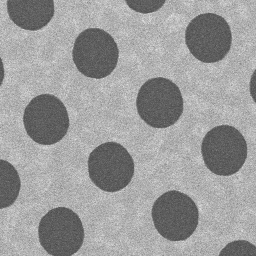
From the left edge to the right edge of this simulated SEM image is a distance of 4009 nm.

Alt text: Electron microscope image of holes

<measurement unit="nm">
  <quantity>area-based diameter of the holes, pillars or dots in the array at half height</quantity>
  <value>754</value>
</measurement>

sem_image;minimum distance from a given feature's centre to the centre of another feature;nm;1250